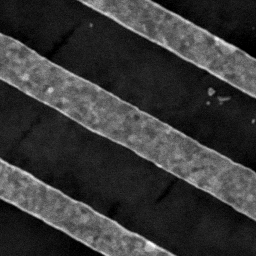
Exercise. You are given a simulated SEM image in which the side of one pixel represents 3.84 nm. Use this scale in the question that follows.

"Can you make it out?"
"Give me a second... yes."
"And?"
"lines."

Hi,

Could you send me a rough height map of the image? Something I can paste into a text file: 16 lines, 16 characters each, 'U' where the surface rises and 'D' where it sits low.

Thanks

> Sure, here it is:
DDDDDDUUUUDDDDDD
DDDDDDDDUUUUDDDD
UDDDDDDDDUUUUUDD
UUUDDDDDDDDUUUUU
UUUUDDDDDDDDDUUU
DUUUUUDDDDDDDDDU
DDDUUUUUDDDDDDDD
DDDDDUUUUUDDDDDD
DDDDDDUUUUUUDDDD
DDDDDDDDUUUUUUDD
UDDDDDDDDDUUUUUD
UUUDDDDDDDDDUUUU
UUUUUDDDDDDDDDUU
DDUUUUUDDDDDDDDU
DDDDUUUUDDDDDDDD
DDDDDDUUUUDDDDDD